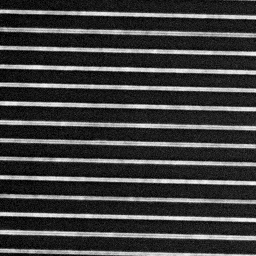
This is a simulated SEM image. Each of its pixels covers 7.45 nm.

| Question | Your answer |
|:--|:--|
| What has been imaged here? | parallel lines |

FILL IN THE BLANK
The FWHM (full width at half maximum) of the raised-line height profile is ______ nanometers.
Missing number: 22.3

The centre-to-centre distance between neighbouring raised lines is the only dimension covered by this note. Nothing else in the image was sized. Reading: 0.137 µm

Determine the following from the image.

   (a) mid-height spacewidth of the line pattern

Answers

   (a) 117 nanometers